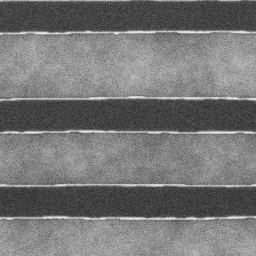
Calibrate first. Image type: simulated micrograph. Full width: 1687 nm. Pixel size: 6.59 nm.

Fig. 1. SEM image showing lines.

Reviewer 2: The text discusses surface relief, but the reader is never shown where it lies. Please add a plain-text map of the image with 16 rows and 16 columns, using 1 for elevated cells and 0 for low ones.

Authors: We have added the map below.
1111111111111111
1111111111111111
0000000000000000
0000000000000000
0000000000000000
0000000000000000
1111111111111111
1111111111111111
0000000000000000
0000000000000000
0000000000000000
0000000000000000
1111111111111111
1111111111111111
0000000000000000
0000000000000000